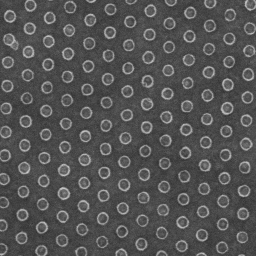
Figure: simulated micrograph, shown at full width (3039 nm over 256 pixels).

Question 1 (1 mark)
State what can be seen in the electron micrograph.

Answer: a regular array of raised bodies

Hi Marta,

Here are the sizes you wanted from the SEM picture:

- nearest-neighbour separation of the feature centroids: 271 nanometers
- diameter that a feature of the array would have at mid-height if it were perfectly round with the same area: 125 nm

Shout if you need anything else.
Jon